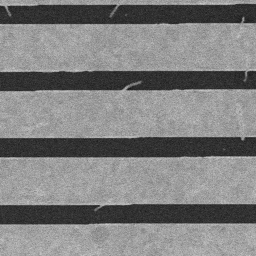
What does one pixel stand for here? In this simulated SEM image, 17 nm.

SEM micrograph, lines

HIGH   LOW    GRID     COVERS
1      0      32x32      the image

11111111111111111111111111111100
00000000000000000000000000000000
00000000000000000000000000000000
11111111111111111111111111111111
11111111111111111111111111111111
11111111111111111111111111111111
11111111111111111111111111111111
11111111111111111111111111111111
11111111111111111111111111111111
00000000000000000000000000000000
00000000000000000000000000000000
11111111111111111111111111111111
11111111111111111111111111111111
11111111111111111111111111111111
11111111111111111111111111111111
11111111111111111111111111111111
11111111111111111111111111111111
00000000000000000000000000000000
00000000000000000000000000000000
00000000000000000000000000000000
11111111111111111111111111111111
11111111111111111111111111111111
11111111111111111111111111111111
11111111111111111111111111111111
11111111111111111111111111111111
11111111111111111000000000000000
00000000000000000000000000000000
00000000000000000000000000000000
11111111111111111111111111111111
11111111111111111111111111111111
11111111111111111111111111111111
11111111111111111111111111111111